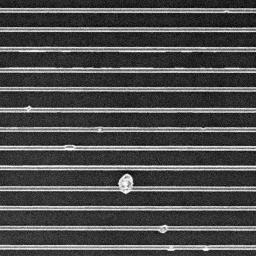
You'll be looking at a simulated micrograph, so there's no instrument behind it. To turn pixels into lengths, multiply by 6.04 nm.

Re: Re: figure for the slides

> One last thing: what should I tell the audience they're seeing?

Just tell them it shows parallel lines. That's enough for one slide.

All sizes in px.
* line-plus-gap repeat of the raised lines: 19.7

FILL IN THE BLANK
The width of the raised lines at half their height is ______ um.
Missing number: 0.0211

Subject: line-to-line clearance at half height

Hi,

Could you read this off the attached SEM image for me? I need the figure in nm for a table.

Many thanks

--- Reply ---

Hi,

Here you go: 95.1